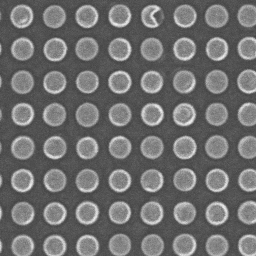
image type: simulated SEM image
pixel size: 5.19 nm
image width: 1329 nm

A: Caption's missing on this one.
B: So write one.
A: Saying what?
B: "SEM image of a regular array of raised bodies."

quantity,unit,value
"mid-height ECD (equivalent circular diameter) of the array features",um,0.117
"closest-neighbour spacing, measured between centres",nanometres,166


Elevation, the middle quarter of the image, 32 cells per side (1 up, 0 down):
00000000000000000000000000000000
00000000000000000000000000000000
00001111000011110000111100001111
00011111000111111001111110011111
00011111100111111001111110011111
00011111000111111001111100011111
00001111000011110000111100001111
00000000000000000000000000000000
00000000000000000000000000000000
00000000000000000000000000000000
00001111000011110000111100001111
00011111000111110001111110001111
00011111100111111001111110011111
00011111000111111001111110001111
00001111000011110000111100001111
00000110000000000000000000000000
00000000000000000000000000000000
00000000000000000000000000000000
00000110000001100000011100000111
00001111000011110000111100001111
00011111000111111001111110001111
00011111000111111001111110001111
00001111000011110000111100001111
00000110000001100000011000000110
00000000000000000000000000000000
00000000000000000000000000000000
00000110000001100000011000000111
00001111000011110000111100001111
00011111000111111001111110001111
00011111100111111001111110001111
00011111000111110000111100001111
00001110000011100000111100000110